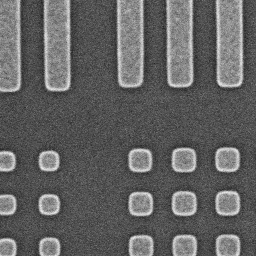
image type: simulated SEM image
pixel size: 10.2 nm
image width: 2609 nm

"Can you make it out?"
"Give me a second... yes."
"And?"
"groups of lines, slits or small figures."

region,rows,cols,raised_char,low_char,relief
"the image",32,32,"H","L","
HHLLLLHHHLLLLLLHHHLLLHHHLLLHHHLL
HHLLLLHHHLLLLLLHHHLLLHHHLLLHHHLL
HHLLLLHHHLLLLLLHHHLLLHHHLLLHHHLL
HHLLLLHHHLLLLLLHHHLLLHHHLLLHHHLL
HHLLLLHHHLLLLLLHHHLLLHHHLLLHHHLL
HHLLLLHHHLLLLLLHHHLLLHHHLLLHHHLL
HHLLLLHHHLLLLLLHHHLLLHHHLLLHHHLL
HHLLLLHHHLLLLLLHHHLLLHHHLLLHHHLL
HHLLLLHHHLLLLLLHHHLLLHHHLLLHHHLL
HHLLLLHHHLLLLLLHHHLLLHHHLLLHHHLL
HHLLLLHHHLLLLLLHHLLLLHHHLLLLHHLL
LLLLLLLLLLLLLLLLLLLLLLLLLLLLLLLL
LLLLLLLLLLLLLLLLLLLLLLLLLLLLLLLL
LLLLLLLLLLLLLLLLLLLLLLLLLLLLLLLL
LLLLLLLLLLLLLLLLLLLLLLLLLLLLLLLL
LLLLLLLLLLLLLLLLLLLLLLLLLLLLLLLL
LLLLLLLLLLLLLLLLLLLLLLLLLLLLLLLL
LLLLLLLLLLLLLLLLLLLLLLLLLLLLLLLL
LLLLLLLLLLLLLLLLLLLLLLLLLLLLLLLL
HHLLLHHLLLLLLLLLHHHLLLHHLLLHHHLL
HHLLLHHLLLLLLLLLHHHLLLHHLLLHHHLL
LLLLLLLLLLLLLLLLLLLLLLLLLLLLLLLL
LLLLLLLLLLLLLLLLLLLLLLLLLLLLLLLL
LLLLLLLLLLLLLLLLLLLLLLLLLLLLLLLL
LLLLLLHLLLLLLLLLHHHLLLHHLLLHHHLL
HHLLLHHLLLLLLLLLHHHLLLHHLLLHHHLL
HHLLLHHLLLLLLLLLHHHLLLHHLLLHHHLL
LLLLLLLLLLLLLLLLLLLLLLLLLLLLLLLL
LLLLLLLLLLLLLLLLLLLLLLLLLLLLLLLL
LLLLLLLLLLLLLLLLLLLLLLLLLLLLLLLL
HHLLLHHLLLLLLLLLHHHLLLHHHLLHHHLL
HHLLLHHLLLLLLLLLHHHLLLHHLLLHHHLL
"